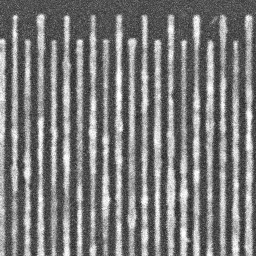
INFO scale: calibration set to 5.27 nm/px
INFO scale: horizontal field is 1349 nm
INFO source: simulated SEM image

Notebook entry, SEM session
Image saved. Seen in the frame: parallel lines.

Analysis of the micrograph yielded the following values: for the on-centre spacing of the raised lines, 13 pixels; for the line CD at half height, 4 pixels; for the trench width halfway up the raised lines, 0.0461 um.